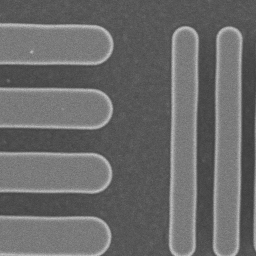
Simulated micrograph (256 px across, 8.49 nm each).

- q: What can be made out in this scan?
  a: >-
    groups of lines, slits or small figures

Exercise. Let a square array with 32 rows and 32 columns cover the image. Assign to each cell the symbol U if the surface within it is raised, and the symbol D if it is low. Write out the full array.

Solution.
DDDDDDDDDDDDDDDDDDDDDDDDDDDDDDDD
DDDDDDDDDDDDDDDDDDDDDDDDDDDDDDDD
DDDDDDDDDDDDDDDDDDDDDDDDDDDDDDDD
UUUUUUUUUUUUUDDDDDDDDDDUDDDDUDDD
UUUUUUUUUUUUUUDDDDDDDDUUUDDUUUDD
UUUUUUUUUUUUUUDDDDDDDDUUUDDUUUDD
UUUUUUUUUUUUUUDDDDDDDDUUUDDUUUDD
UUUUUUUUUUUUUDDDDDDDDDUUUDDUUUDD
DDDDDDDDDDDDDDDDDDDDDDUUUDDUUUDD
DDDDDDDDDDDDDDDDDDDDDDUUUDDUUUDD
DDDDDDDDDDDDDDDDDDDDDDUUUDDUUUDD
UUUUUUUUUUUUUDDDDDDDDDUUUDDUUUDD
UUUUUUUUUUUUUUDDDDDDDDUUUDDUUUDD
UUUUUUUUUUUUUUDDDDDDDDUUUDDUUUDD
UUUUUUUUUUUUUUDDDDDDDDUUUDDUUUDD
UUUUUUUUUUUUUDDDDDDDDDUUDDDUUUDD
DDDDDDDDDDDDDDDDDDDDDDUUDDDUUUDD
DDDDDDDDDDDDDDDDDDDDDDUUDDDUUUDD
DDDDDDDDDDDDDDDDDDDDDUUUDDDUUUDD
UUUUUUUUUUUUUDDDDDDDDUUUDDDUUUDD
UUUUUUUUUUUUUUDDDDDDDUUUDDDUUUDD
UUUUUUUUUUUUUUDDDDDDDUUUDDDUUUDD
UUUUUUUUUUUUUUDDDDDDDUUUDDDUUUDD
UUUUUUUUUUUUUDDDDDDDDUUUDDDUUUDD
DDDDDDDDDDDDDDDDDDDDDUUUDDDUUUDD
DDDDDDDDDDDDDDDDDDDDDUUUDDDUUUDD
DDDDDDDDDDDDDDDDDDDDDUUUDDDUUUDD
UUUUUUUUUUUUUDDDDDDDDUUUDDDUUUDD
UUUUUUUUUUUUUUDDDDDDDUUUDDDUUUDD
UUUUUUUUUUUUUUDDDDDDDUUUDDDUUUDD
UUUUUUUUUUUUUUDDDDDDDUUUDDDUUUDD
UUUUUUUUUUUUUDDDDDDDDDUUDDDUUUDD